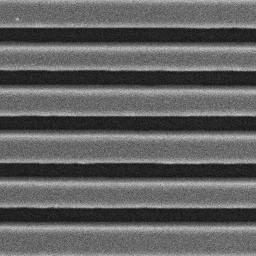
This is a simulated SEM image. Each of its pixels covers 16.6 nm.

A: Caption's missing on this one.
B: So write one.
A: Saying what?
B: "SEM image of lines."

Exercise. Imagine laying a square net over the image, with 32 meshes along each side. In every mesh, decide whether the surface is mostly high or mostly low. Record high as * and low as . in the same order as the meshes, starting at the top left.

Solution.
********************************
********************************
********************************
................................
................................
................................
********************************
********************************
********************************
................................
................................
********************************
********************************
********************************
................................
................................
................................
********************************
********************************
********************************
................................
................................
***************************.....
********************************
********************************
********************************
................................
................................
********************************
********************************
********************************
********************************